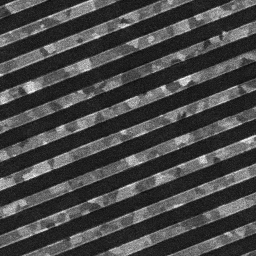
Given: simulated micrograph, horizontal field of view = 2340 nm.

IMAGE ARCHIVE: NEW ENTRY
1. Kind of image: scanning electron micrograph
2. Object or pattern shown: parallel lines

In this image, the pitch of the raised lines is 244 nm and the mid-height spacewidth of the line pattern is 16.9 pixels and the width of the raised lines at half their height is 90.4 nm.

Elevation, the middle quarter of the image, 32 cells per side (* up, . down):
..******............******......
******...........*******........
***............******...........
*...........*******...........**
..........******...........*****
.......*******...........*******
.....******...........********..
..*******...........*******.....
******...........*******........
****...........*******..........
*...........*******...........**
..........*******...........****
.......*******...........*******
....********...........*******..
..*******...........********....
*******...........*******.......
****...........*******..........
**...........*******...........*
..........*******...........****
.......********...........******
.....*******...........*******..
..********...........******.....
*******...........*******.......
*****...........******..........
**...........*******...........*
...........******............***
........*******...........******
.....*******............******..
...*******...........*******....
*******............******.......
****............*******.........
**............******............